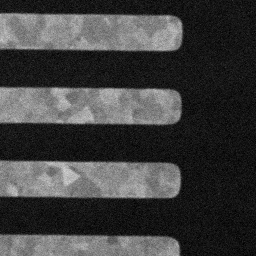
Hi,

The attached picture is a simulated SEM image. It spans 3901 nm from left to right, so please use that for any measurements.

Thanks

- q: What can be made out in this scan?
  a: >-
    groups of lines, slits or small figures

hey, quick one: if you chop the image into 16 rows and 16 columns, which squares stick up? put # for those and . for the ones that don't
................
###########.....
###########.....
................
................
................
###########.....
###########.....
................
................
###########.....
###########.....
................
................
................
###########.....